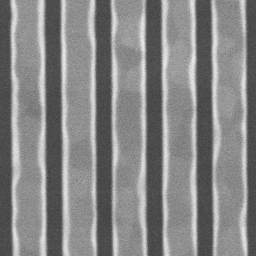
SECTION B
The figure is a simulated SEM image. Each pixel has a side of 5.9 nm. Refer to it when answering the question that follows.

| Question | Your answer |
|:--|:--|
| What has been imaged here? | wiring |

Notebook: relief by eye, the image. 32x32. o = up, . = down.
..ooo...oooo..oooo..oooo...ooo..
..ooo...oooo..oooo..oooo...ooo..
..ooo...ooo...oooo..oooo...oooo.
..ooo...ooo...oooo..oooo...oooo.
..ooo...oooo..oooo..oooo...oooo.
..ooo...oooo..oooo...ooo...oooo.
..ooo...oooo..oooo...ooo...oooo.
..ooo...oooo..oooo...ooo...oooo.
..ooo...oooo..oooo..oooo...oooo.
..ooo...oooo..oooo..oooo...oooo.
..ooo...oooo..oooo..oooo...oooo.
..ooo...oooo..oooo...ooo...oooo.
..ooo...oooo..oooo...ooo...oooo.
..ooo...oooo..oooo...ooo...oooo.
..ooo...oooo..oooo...ooo...oooo.
..ooo...oooo..oooo...ooo...oooo.
..ooo...oooo..oooo...ooo...oooo.
..ooo...oooo..oooo...ooo...oooo.
..ooo...oooo..oooo...ooo...oooo.
..ooo...oooo..oooo...ooo...oooo.
..ooo...oooo..oooo...ooo...oooo.
..oooo..oooo..oooo...ooo...oooo.
..oooo..oooo..oooo...ooo...oooo.
..ooo...oooo..oooo..oooo...oooo.
..oooo..oooo..oooo..oooo...oooo.
..oooo..oooo..oooo...ooo...oooo.
..oooo..oooo..oooo...ooo...oooo.
..oooo..oooo..oooo...ooo...ooo..
..oooo..oooo..oooo...ooo...ooo..
..oooo..oooo..oooo...ooo...oooo.
..ooo...oooo..oooo...ooo...oooo.
..ooo...oooo..oooo...ooo...oooo.